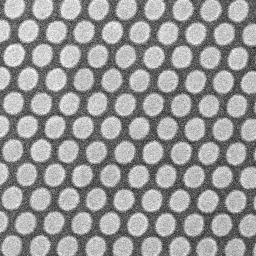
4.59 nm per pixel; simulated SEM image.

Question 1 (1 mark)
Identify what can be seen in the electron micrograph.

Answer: a regular array of raised bodies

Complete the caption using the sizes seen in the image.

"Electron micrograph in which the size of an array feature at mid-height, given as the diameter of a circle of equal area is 92.3 nm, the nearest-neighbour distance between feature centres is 126 nm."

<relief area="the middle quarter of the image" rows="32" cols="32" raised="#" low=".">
##.....##.....##.....##.....##..
....##......#...................
...####...####...####...####....
...####...####...####...####...#
...####...####...####...####...#
...####...####...####...####...#
....#......##.....##.....##....#
.#......##......................
###....###....###....###....###.
####..#####..#####..#####..#####
###...####...####...#####..#####
###...####...####...####...####.
##.....##.....##.....##.....##..
....##......#...................
...####...####...####...####...#
...####..#####...####...####...#
...####..#####..#####...####..##
...###....###....####...###...##
...........#......#.....###....#
##..............................
###...####....###....###....###.
###...####...#####..####...####.
###...####...#####..####...#####
##....####...####...####...####.
#......##.....##.....##.....##..
....##.....##...................
...####...####...####...###....#
..#####..#####..#####..#####..##
..#####..#####..#####..#####..##
..####....###...####...####...##
...........#.....##.....###....#
##.....##.......................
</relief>